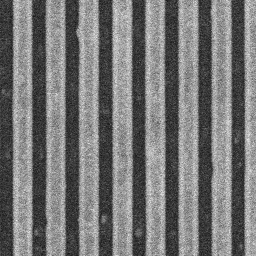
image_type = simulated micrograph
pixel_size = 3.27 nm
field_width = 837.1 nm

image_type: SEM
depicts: parallel lines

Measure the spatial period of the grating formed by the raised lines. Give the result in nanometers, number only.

108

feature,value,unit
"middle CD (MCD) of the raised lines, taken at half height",51.1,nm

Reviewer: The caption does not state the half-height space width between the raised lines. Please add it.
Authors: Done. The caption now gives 57.7 nanometers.